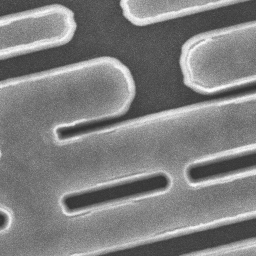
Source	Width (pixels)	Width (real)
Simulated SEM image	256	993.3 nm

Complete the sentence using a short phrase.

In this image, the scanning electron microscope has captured one or a few lines or trenches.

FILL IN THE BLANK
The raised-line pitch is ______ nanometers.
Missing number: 264